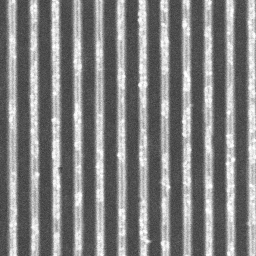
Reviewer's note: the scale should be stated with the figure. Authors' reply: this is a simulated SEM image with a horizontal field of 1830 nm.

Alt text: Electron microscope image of parallel lines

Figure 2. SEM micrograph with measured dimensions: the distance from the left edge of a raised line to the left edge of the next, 21.8 pixels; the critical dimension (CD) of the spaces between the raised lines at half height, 93.9 nanometers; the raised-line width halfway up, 61.7 nm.